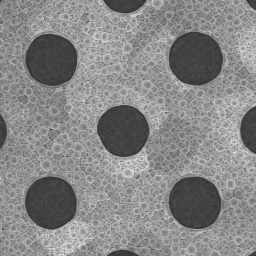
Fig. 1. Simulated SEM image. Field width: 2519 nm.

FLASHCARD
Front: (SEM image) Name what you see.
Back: holes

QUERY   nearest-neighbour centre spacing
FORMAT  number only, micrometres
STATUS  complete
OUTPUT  1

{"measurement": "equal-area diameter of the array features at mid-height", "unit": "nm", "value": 517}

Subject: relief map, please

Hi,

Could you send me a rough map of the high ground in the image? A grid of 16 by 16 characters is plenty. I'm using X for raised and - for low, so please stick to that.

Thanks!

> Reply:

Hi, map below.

XXXXXXX--XXXXXXX
XXXXXXXXXXXXXXXX
XX--XXXXXXX--XXX
XX---XXXXXX---XX
XX---XXXXXX---XX
XXXXXXXXXXXXXXXX
XXXXXXXXXXXXXXXX
XXXXXX---XXXXXX-
XXXXXX---XXXXXX-
XXXXXXX--XXXXXXX
XXXXXXXXXXXXXXXX
XX--XXXXXXX--XXX
XX---XXXXXX---XX
XX---XXXXXX---XX
XXXXXXXXXXXXXXXX
XXXXXXXXXXXXXXXX